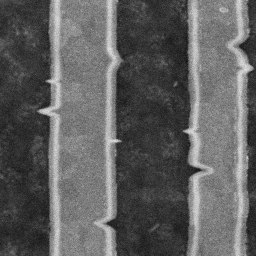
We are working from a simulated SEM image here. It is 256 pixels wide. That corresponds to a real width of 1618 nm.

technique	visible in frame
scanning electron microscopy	one or a few lines or trenches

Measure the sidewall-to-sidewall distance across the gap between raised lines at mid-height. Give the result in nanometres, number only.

544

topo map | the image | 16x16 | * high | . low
....***.....***.
....***.....***.
....***.....***.
....***.....***.
....***.....***.
....***.....***.
...****.....***.
....***.....***.
....***.....***.
....***.....***.
....***......**.
...****.....***.
....***.....***.
....***.....***.
....***.....***.
...****.....***.